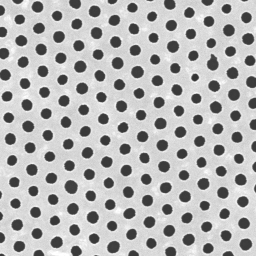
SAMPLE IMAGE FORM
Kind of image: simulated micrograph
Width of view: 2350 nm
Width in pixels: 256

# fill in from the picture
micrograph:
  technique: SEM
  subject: a regular array of holes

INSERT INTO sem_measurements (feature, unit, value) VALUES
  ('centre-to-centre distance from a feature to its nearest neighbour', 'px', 21.2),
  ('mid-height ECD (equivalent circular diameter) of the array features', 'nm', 102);